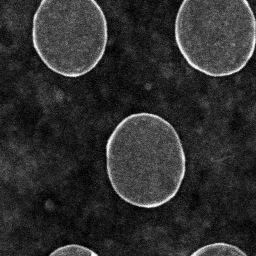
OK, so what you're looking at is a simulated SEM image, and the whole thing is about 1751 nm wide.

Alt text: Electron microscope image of raised bodies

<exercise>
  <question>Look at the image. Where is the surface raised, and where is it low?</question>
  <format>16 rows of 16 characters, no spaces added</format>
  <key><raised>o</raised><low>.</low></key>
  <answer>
..oooo.....ooooo
..ooooo....ooooo
..ooooo....ooooo
...ooo......oooo
....o........oo.
................
................
........oo......
.......oooo.....
.......oooo.....
.......oooo.....
.......oooo.....
........oo......
................
................
.............oo.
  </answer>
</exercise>